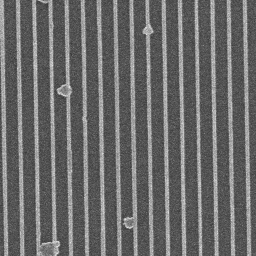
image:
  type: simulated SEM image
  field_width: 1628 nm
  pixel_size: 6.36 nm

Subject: parallel lines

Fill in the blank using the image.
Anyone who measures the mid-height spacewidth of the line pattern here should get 81.9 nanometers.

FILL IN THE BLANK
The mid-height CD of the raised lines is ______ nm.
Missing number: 20.7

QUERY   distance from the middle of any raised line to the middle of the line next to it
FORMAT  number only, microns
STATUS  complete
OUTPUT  0.103